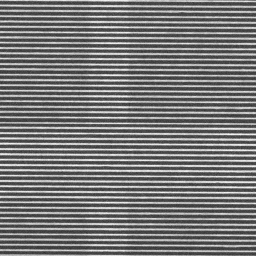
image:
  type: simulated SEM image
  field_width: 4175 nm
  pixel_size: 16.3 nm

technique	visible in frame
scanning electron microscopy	parallel lines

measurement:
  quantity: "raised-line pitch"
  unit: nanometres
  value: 86.7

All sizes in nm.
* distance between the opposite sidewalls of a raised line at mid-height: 26.5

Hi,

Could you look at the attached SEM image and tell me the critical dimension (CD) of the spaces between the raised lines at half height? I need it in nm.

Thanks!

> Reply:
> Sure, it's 65.2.